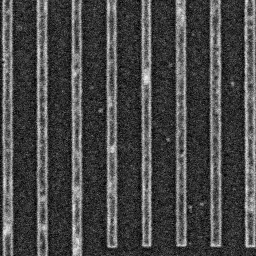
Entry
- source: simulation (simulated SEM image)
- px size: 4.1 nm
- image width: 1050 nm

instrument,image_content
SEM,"parallel lines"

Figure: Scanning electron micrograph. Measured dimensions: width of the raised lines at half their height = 35.9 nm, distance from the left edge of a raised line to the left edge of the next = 0.142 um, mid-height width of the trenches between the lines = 0.108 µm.